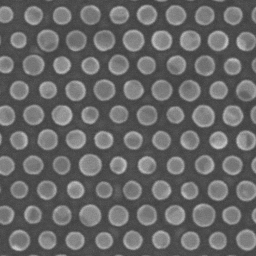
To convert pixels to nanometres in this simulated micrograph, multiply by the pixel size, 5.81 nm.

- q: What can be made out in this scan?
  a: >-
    a regular array of raised bodies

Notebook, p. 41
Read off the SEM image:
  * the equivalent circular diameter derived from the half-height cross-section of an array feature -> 108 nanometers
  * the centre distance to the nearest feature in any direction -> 163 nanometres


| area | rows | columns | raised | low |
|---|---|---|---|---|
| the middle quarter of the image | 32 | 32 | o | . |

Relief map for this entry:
o...ooooo..ooooo...oooo...oooo..
o....ooo....oooo...ooo....oooo..
......o....................oo...
................................
..oo....oooo....ooo....ooo....oo
.oooo...ooooo..oooo...ooooo..ooo
.oooo...ooooo..ooooo..ooooo..ooo
.oooo...ooooo..oooo...ooooo..ooo
..ooo...oooo....ooo....ooo....oo
................................
....................oo..........
oo...ooo....oooo...oooo...ooo...
oo...ooo...ooooo..ooooo...oooo..
oo...ooo....oooo..ooooo...oooo..
o....oo......oo....oooo....oo...
................................
................................
.oooo...ooo.....ooo....ooo....oo
.oooo...oooo...oooo...ooooo..ooo
.oooo...oooo...oooo...ooooo..ooo
.oooo...oooo....ooo....ooo....oo
................................
................................
o....oooo...........oo.....o....
o...ooooo...ooo....oooo...oooo..
o...ooooo...oooo...oooo...oooo..
o...ooooo...ooo....oooo...oooo..
.....ooo........................
................................
..o.............oo.....oo.......
.oooo...oooo...oooo...oooo....oo
.oooo...oooo...oooo...ooooo..ooo